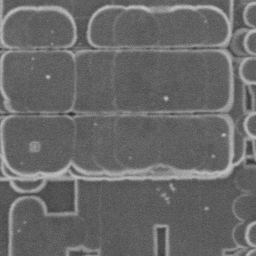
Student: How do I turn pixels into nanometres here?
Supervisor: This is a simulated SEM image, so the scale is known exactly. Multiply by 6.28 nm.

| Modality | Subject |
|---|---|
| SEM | wiring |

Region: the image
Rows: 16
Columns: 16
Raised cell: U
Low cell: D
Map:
UUUUUUUUUUUUUUDD
UUUUUUUUUUUUUUDD
UUUUUUUUUUUUUUUU
UUUUUUUUUUUUUUDU
UUUUUUUUUUUUUUUU
UUUUUUUUUUUUUUUD
UUUUUUUUUUUUUUUD
UUUUUUUUUUUUUUUU
UUUUUUUUUUUUUUUU
UUUUUUUUUUUUUUUD
UUUUUUUUUUUUUUDD
DDDDDDDDDDDDDDDD
DDDDDDDDDDDDDDDD
DDDDDDDDDDDDDDDD
DDDDDDDDDDDDDDDD
DDDDDDDDDDDDDDDD